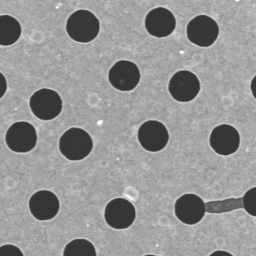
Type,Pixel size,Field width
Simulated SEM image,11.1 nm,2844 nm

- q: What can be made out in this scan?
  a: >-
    a regular array of holes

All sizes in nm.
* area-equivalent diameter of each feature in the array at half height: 351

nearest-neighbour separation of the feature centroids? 648 nm